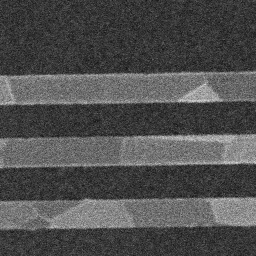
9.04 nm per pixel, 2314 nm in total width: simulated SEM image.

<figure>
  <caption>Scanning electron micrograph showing one or a few lines or trenches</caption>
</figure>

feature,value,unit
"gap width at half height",309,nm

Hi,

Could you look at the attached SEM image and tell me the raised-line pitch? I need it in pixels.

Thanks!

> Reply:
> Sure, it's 62.5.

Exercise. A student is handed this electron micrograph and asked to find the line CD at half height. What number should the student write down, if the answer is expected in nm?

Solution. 252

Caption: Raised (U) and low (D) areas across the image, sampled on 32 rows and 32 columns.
DDDDDDDDDDDDDDDDDDDDDDDDDDDDDDDD
DDDDDDDDDDDDDDDDDDDDDDDDDDDDDDDD
DDDDDDDDDDDDDDDDDDDDDDDDDDDDDDDD
DDDDDDDDDDDDDDDDDDDDDDDDDDDDDDDD
DDDDDDDDDDDDDDDDDDDDDDDDDDDDDDDD
DDDDDDDDDDDDDDDDDDDDDDDDDDDDDDDD
DDDDDDDDDDDDDDDDDDDDDDDDDDDDDDDD
DDDDDDDDDDDDDDDDDDDDDDDDDDDDDDDD
DDDDDDDDDDDDDDDDDDDDDDDDDDDDDDDD
DDDDDDDDDUUUUUUUUUUUUUUUUUUUUUUU
UUUUUUUUUUUUUUUUUUUUUUUUUUUUUUUU
UUUUUUUUUUUUUUUUUUUUUUUUUUUUUUUU
UUUUUUUUUUUUUUUUUUUUUUUUUUUUUUUU
DDDDDDDDDDDDDDDDDDDDDDDDDDDDDDDD
DDDDDDDDDDDDDDDDDDDDDDDDDDDDDDDD
DDDDDDDDDDDDDDDDDDDDDDDDDDDDDDDD
DDDDDDDDDDDDDDDDDDDDDDDDDDDDDDDD
UUUUUUUUUUUUUUUUUUUUUUUUUUUUUUUU
UUUUUUUUUUUUUUUUUUUUUUUUUUUUUUUU
UUUUUUUUUUUUUUUUUUUUUUUUUUUUUUUU
UUUUUUUUUUUUUUUUUUUUUDDDDDDDDDDD
DDDDDDDDDDDDDDDDDDDDDDDDDDDDDDDD
DDDDDDDDDDDDDDDDDDDDDDDDDDDDDDDD
DDDDDDDDDDDDDDDDDDDDDDDDDDDDDDDD
DDDDDDDDDDDDDDDDDDDDDDDDDDDDDDDD
UUUUUUUUUUUUUUUUUUUUUUUUUUUUUUUU
UUUUUUUUUUUUUUUUUUUUUUUUUUUUUUUU
UUUUUUUUUUUUUUUUUUUUUUUUUUUUUUUU
UUUUUUUDDDDDDDDDDDDDDDDDDDDDDDDD
DDDDDDDDDDDDDDDDDDDDDDDDDDDDDDDD
DDDDDDDDDDDDDDDDDDDDDDDDDDDDDDDD
DDDDDDDDDDDDDDDDDDDDDDDDDDDDDDDD